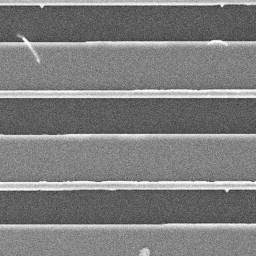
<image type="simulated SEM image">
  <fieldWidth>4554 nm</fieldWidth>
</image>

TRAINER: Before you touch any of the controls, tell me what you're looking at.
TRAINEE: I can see lines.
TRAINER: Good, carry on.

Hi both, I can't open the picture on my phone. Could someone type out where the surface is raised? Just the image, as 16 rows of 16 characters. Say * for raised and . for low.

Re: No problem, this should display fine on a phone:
................
................
................
****************
****************
****************
................
................
****************
****************
****************
****************
................
................
****************
****************